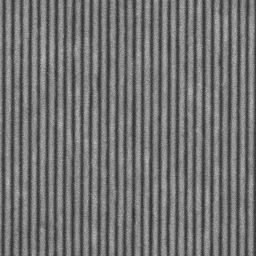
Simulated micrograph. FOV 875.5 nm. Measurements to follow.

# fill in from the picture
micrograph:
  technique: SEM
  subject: parallel lines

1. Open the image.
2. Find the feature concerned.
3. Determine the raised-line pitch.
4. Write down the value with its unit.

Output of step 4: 0.0297 micrometres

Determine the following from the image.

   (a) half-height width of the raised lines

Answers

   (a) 18.8 nanometres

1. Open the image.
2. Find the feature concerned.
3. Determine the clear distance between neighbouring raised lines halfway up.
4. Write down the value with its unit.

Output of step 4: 0.0124 um